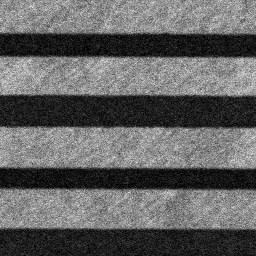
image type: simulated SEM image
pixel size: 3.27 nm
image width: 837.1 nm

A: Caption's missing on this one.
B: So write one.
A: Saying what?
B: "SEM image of one or a few lines or trenches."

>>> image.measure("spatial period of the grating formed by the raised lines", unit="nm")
218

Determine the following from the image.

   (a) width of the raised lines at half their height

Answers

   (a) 37.9 px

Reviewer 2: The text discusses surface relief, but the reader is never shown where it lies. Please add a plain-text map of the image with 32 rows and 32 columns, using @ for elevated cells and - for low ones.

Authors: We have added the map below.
@@@@@@@@@@@@@@@@@@@@@@@@@@@@@@@@
@@@@@@@@@@@@@@@@@@@@@@@@@@@@@@@@
@@@@@@@@@@@@@@@@@@@@@@@@@@@@@@@@
@@@@@@@@@@@@@@@@@@@@@@@@@@@@@@@@
--------------------------------
--------------------------------
--------------------------------
@@@@@@@@@@@@@@@@@@@@@@@@@@@@@@@@
@@@@@@@@@@@@@@@@@@@@@@@@@@@@@@@@
@@@@@@@@@@@@@@@@@@@@@@@@@@@@@@@@
@@@@@@@@@@@@@@@@@@@@@@@@@@@@@@@@
@@@@@@@@@@@@@@@@@@@@@@@@@@@@@@@@
--------------------------------
--------------------------------
--------------------------------
--------------------------------
@@@@@@@@@@@@@@@@@@@@@@@@@@@@@@@@
@@@@@@@@@@@@@@@@@@@@@@@@@@@@@@@@
@@@@@@@@@@@@@@@@@@@@@@@@@@@@@@@@
@@@@@@@@@@@@@@@@@@@@@@@@@@@@@@@@
@@@@@@@@@@@@@@@@@@@@@@@@@@@@@@@@
--------------------------------
--------------------------------
--------------------------------
@@@@@@@@@@@@@@@@@@@@@@@@@@@@@@@@
@@@@@@@@@@@@@@@@@@@@@@@@@@@@@@@@
@@@@@@@@@@@@@@@@@@@@@@@@@@@@@@@@
@@@@@@@@@@@@@@@@@@@@@@@@@@@@@@@@
---------------------------@@@@@
--------------------------------
--------------------------------
--------------------------------